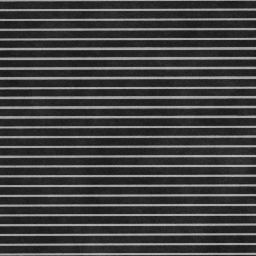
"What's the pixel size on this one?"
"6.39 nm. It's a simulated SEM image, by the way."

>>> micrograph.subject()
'parallel lines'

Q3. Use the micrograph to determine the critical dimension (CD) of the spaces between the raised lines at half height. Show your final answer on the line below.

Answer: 49.5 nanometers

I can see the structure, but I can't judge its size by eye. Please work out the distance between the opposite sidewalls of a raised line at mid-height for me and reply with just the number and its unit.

12.8 nm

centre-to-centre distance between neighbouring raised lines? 62.3 nm